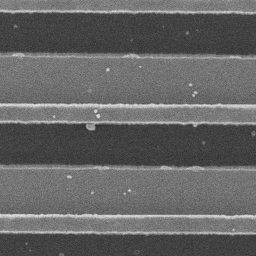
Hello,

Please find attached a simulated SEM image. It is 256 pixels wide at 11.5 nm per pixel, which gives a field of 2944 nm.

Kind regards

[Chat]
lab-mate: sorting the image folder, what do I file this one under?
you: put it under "lines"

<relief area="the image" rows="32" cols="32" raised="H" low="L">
HHHHHHHHHHHHHHHHHHHHHHHHHHHHHHHH
LLLLLLLLLLLLHHLLHHLLHHHHHHHHHHHH
LLLLLLLLLLLLLLLLLLLLLLLLLLLLLLLL
LLLLLLLLLLLLLLLLLLLLLLLLLLLLLLLL
LLLLLLLLLLLLLLLLLLLLLLLLLLLLLLLL
LLLLLLLLLLLLLLLLLLLLLLLLLLLLLLLL
LLLLLLLLLLLLLLLLLLLLLLLLLLLLLLLL
HHHHHHHHHHHHHHHHHHHHHHHHHHHHHHHH
HHHHHHHHHHHHHHHHHHHHHHHHHHHHHHHH
HHHHHHHHHHHHHHHHHHHHHHHHHHHHHHHH
HHHHHHHHHHHHHHHHHHHHHHHHHHHHHHHH
HHHHHHHHHHHHHHHHHHHHHHHHHHHHHHHH
HHHHHHHHHHHHHHHHHHHHHHHHHHHHHHHH
HHHHHHHHHHHHHHHHHHHHHHHHHHHHHHHH
HHHHHHHHHHHHHHHHHHHHHHHHHHHHHHHH
LLLLLLLLLLHHLLLLLLLLLLLLHLLLLLLL
LLLLLLLLLLLLLLLLLLLLLLLLLLLLLLLL
LLLLLLLLLLLLLLLLLLLLLLLLLLLLLLLL
LLLLLLLLLLLLLLLLLLLLLLLLLLLLLLLL
LLLLLLLLLLLLLLLLLLLLLLLLLLLLLLLL
LLLLLLLLLLLLLLLLLLLLLLLLLLLLLLLL
HHHHHHHHHHHHHHHHHHHHHHHHHHHHHHHH
HHHHHHHHHHHHHHHHHHHHHHHHHHHHHHHH
HHHHHHHHHHHHHHHHHHHHHHHHHHHHHHHH
HHHHHHHHHHHHHHHHHHHHHHHHHHHHHHHH
HHHHHHHHHHHHHHHHHHHHHHHHHHHHHHHH
HHHHHHHHHHHHHHHHHHHHHHHHHHHHHHHH
HHHHHHHHHHHHHHHHHHHHHHHHHHHHHHHH
HHHHHHHHHHHHHHHHHHHHHHHHHHHHHHHH
LLLLLLLLLLLLLLLLLLLLLLLLLLLLLLLL
LLLLLLLLLLLLLLLLLLLLLLLLLLLLLLLL
LLLLLLLLLLLLLLLLLLLLLLLLLLLLLLLL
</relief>